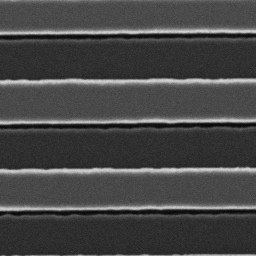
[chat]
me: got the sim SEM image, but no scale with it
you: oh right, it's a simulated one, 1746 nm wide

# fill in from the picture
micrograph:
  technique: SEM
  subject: lines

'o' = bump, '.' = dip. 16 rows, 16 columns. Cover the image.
oooooooooooooooo
oooooooooooooooo
................
................
................
oooooooooooooooo
oooooooooooooooo
oooooooooooooooo
................
................
...............o
oooooooooooooooo
oooooooooooooooo
................
................
................